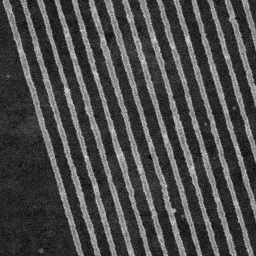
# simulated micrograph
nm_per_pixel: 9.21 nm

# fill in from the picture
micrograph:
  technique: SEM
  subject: parallel lines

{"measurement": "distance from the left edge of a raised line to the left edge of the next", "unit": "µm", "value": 0.15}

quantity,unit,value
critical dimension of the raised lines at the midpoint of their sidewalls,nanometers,38.7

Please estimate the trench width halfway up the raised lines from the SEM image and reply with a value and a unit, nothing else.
12.2 px